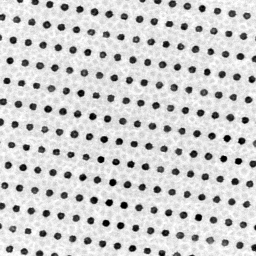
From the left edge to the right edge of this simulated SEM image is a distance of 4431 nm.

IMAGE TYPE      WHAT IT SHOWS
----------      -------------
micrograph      a regular array of holes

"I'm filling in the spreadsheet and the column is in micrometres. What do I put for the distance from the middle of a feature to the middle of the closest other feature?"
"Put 0.259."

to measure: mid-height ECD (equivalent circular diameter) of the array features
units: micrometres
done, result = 0.137